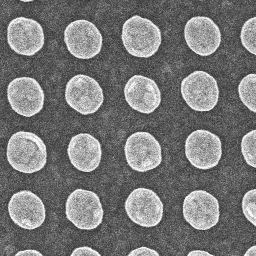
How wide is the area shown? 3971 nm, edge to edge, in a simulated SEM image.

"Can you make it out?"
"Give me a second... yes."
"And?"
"a regular array of raised bodies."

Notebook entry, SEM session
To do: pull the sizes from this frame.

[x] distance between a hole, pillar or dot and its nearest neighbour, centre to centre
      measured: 0.874 micrometres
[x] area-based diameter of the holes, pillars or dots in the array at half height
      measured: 580 nm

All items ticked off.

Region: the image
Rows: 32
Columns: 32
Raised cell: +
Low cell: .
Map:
................................
................................
..++............++......++.....+
.++++...++++...+++++...++++...++
.++++...+++++..+++++...++++...++
.++++...+++++...++++....+++...++
..++.....+++....+++......++....+
................................
................................
..........+.............++.....+
.++++....+++....+++....++++...++
.++++...+++++...++++...++++...++
.++++...+++++...++++...++++...++
..+++....+++.....++.....++.....+
................................
................................
........................++.....+
.++++....+++....+++....++++...++
.+++++...++++...++++...+++++..++
.+++++...++++...++++...+++++...+
.+++++...+++....++++....+++....+
...+............................
................................
................................
..++.....+++....++++...+++.....+
.++++...+++++...++++...++++...++
.+++++..+++++...++++...++++...++
..+++....++++....+++...++++....+
...+......++............++......
................................
................................
...++....+++....+++.....++.....+